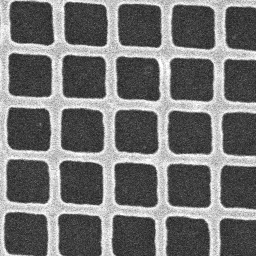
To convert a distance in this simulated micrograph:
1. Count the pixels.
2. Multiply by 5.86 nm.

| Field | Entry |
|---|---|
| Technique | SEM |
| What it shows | a regular array of holes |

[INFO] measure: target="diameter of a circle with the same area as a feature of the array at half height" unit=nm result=280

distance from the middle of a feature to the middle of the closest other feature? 309 nanometers